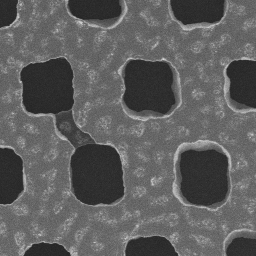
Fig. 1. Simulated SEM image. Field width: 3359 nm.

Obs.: holes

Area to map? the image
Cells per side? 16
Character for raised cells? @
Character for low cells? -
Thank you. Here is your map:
-@@@----@@@---@@
-@@@@@-@@@@@@@@@
@@@@@@@@@@@@@@@@
@@@@@@@@@@@@@@@@
@----@@@---@@@--
@----@@@---@@@--
@----@@@---@@@@-
@@@--@@@@@@@@@@@
@@@@--@@@@@@@@@@
-@@@@--@@@@---@@
-@@@----@@@---@@
-@@@----@@@---@@
-@@@@--@@@@@--@@
@@@@@@@@@@@@@@@@
@@@@@@@@@@@@@@@-
@@--@@@@---@@@--